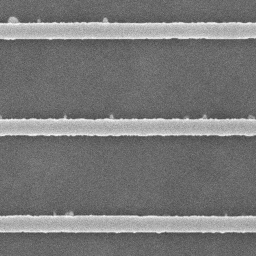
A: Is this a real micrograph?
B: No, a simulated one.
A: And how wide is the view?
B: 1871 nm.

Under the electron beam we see lines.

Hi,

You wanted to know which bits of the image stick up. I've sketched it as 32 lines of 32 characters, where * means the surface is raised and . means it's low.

................................
................................
................................
********************************
********************************
................................
................................
................................
................................
................................
................................
................................
................................
................................
................................
********************************
********************************
................................
................................
................................
................................
................................
................................
................................
................................
................................
................................
********************************
********************************
................................
................................
................................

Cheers